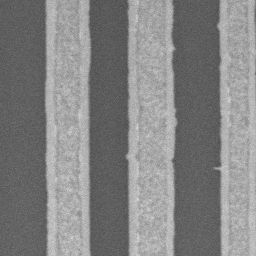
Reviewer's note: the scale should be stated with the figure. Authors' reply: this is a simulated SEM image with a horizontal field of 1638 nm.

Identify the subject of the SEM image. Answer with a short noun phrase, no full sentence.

one or a few lines or trenches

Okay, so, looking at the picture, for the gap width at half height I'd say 326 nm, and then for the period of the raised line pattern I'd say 545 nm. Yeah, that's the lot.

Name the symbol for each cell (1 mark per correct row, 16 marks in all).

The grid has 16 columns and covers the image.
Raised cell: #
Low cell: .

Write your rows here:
...##...###...##
...##...###...##
...##...###...##
...##...###...##
...##...###...##
...##...###...##
...##...###...##
...##...###...##
...##...###...##
...##...###...##
...##...###...##
...##...###...##
...##...###...##
...##...###...##
...##...###...##
...##...###...##